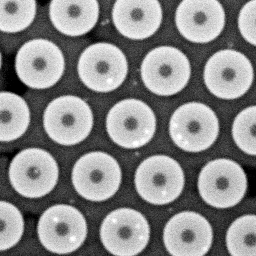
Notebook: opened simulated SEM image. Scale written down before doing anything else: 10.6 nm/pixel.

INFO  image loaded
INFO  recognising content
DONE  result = an array of small figures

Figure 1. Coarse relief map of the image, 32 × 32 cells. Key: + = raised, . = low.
++++..++++++..++++++...++++....+
++++..++++++..++++++..++++++..++
++++..++++++..++++++..++++++..++
+++....++++....+++++..++++++..++
................+++....++++...++
...++++.....++..................
..++++++...++++....++++....+++..
..++++++..++++++..+++++...+++++.
..++++++..++++++..++++++..+++++.
..++++++..++++++..++++++..++++++
...++++....++++...+++++...+++++.
...................+++....+++++.
+++....+++......+...............
+++...+++++...+++++...++++.....+
++++..+++++..++++++...+++++...++
+++...+++++..++++++..++++++..+++
+++...+++++...+++++..++++++..+++
+......+++....+++++...+++++..+++
.......................+++....++
..++++.....+++..................
.++++++...+++++...++++....++++..
.++++++..++++++..++++++..+++++..
.++++++..++++++..++++++..++++++.
..+++++..++++++..++++++..++++++.
...++.....++++....++++...+++++..
+.........................+++...
++....++++....+++...............
+++..++++++..+++++...+++++....++
+++..++++++..++++++..+++++...+++
+++..++++++..++++++..+++++..++++
++...+++++...+++++...+++++..++++
.......++.....+++....+++++...+++